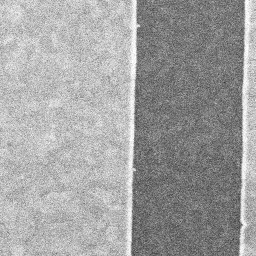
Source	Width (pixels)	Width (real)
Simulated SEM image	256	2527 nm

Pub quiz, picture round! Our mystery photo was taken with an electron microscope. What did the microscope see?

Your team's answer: one or a few lines or trenches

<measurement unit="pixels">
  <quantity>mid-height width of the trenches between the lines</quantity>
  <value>112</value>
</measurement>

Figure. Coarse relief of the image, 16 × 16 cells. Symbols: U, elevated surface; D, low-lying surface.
UUUUUUUUDDDDDDDU
UUUUUUUUDDDDDDDU
UUUUUUUUDDDDDDDU
UUUUUUUUDDDDDDDU
UUUUUUUUDDDDDDDU
UUUUUUUUDDDDDDDU
UUUUUUUUDDDDDDDU
UUUUUUUUDDDDDDDU
UUUUUUUUDDDDDDDU
UUUUUUUUDDDDDDDU
UUUUUUUUDDDDDDDU
UUUUUUUUDDDDDDDU
UUUUUUUUDDDDDDDU
UUUUUUUUDDDDDDDU
UUUUUUUUDDDDDDDU
UUUUUUUUDDDDDDDU